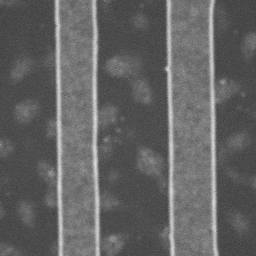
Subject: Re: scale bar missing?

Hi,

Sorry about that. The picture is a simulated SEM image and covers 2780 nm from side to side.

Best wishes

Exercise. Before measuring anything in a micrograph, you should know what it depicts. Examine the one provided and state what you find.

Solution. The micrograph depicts one or a few lines or trenches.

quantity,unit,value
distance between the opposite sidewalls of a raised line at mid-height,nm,442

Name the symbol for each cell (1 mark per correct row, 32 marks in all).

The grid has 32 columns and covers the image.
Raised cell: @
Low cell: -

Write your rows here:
-------@@@@@---------@@@@@@-----
-------@@@@@---------@@@@@------
-------@@@@@---------@@@@@------
-------@@@@@---------@@@@@------
-------@@@@@---------@@@@@------
-------@@@@@---------@@@@@------
-------@@@@@---------@@@@@------
-------@@@@@---------@@@@@------
-------@@@@@---------@@@@@------
-------@@@@@---------@@@@@------
-------@@@@@---------@@@@@@-----
-------@@@@@---------@@@@@@-----
-------@@@@@---------@@@@@@-----
-------@@@@@---------@@@@@@-----
-------@@@@@---------@@@@@@-----
-------@@@@@---------@@@@@@-----
-------@@@@@---------@@@@@@-----
-------@@@@@---------@@@@@@-----
-------@@@@@---------@@@@@@-----
-------@@@@@---------@@@@@@-----
-------@@@@@---------@@@@@@-----
-------@@@@@---------@@@@@@-----
-------@@@@@---------@@@@@@-----
-------@@@@@---------@@@@@@-----
-------@@@@@---------@@@@@@-----
-------@@@@@---------@@@@@@-----
--------@@@@---------@@@@@@-----
--------@@@@---------@@@@@@-----
--------@@@@---------@@@@@@-----
--------@@@@---------@@@@@@-----
--------@@@@---------@@@@@@-----
--------@@@@----------@@@@@-----